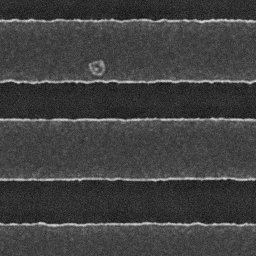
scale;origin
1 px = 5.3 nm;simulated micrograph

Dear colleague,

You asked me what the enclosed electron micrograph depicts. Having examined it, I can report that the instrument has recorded lines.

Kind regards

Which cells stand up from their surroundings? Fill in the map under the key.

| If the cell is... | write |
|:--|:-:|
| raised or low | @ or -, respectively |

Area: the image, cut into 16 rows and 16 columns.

----------------
@@@@@@@@@@@@@@@@
@@@@@@@@@@@@@@@@
@@@@@@@@@@@@@@@@
@@@@@@@@@@@@@@@@
----------------
----------------
@@@@@@@@@@@@@@@@
@@@@@@@@@@@@@@@@
@@@@@@@@@@@@@@@@
@@@@@@@@@@@@@@@@
----------------
----------------
----------------
@@@@@@@@@@@@@@@@
@@@@@@@@@@@@@@@@